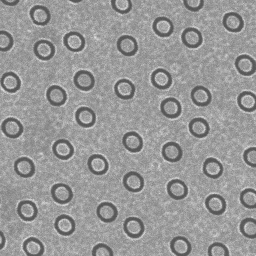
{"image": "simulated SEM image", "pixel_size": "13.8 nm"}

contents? a regular array of ring-shaped grooves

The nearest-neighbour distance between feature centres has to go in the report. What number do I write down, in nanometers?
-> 492